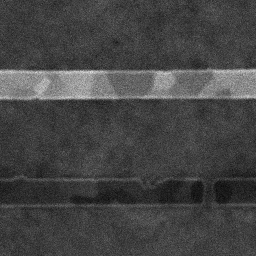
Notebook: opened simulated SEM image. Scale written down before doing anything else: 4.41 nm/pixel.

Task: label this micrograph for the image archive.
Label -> one or a few lines or trenches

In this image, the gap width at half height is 359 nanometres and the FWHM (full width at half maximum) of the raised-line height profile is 0.117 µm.